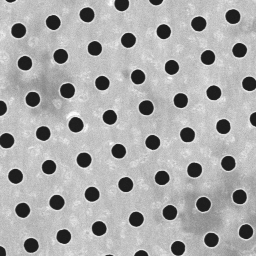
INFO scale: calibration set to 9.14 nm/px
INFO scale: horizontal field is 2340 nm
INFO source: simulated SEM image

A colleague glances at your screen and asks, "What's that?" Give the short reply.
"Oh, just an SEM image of a regular array of holes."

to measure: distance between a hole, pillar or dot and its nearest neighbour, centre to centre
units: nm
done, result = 316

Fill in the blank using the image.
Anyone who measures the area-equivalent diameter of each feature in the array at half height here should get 134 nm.